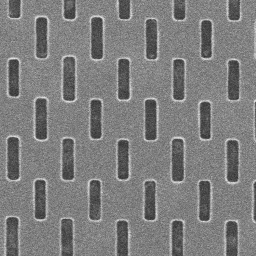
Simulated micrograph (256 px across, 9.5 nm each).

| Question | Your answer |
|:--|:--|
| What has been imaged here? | a regular array of holes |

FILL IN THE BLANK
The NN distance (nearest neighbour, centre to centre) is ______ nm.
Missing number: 458